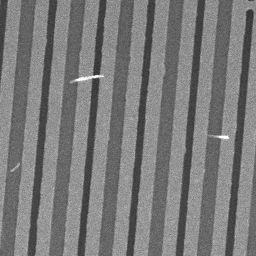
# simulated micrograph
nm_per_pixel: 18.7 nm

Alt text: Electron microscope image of parallel lines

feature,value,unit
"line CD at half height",251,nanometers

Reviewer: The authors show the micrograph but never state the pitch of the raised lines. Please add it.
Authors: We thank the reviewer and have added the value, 459 nanometers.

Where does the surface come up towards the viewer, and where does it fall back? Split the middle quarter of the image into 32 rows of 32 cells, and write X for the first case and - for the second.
----XXX--XXXX---XXXX-XXXX----XXX
----XXX--XXXX---XXXX-XXXX----XXX
----XXX--XXX----XXX--XXXX----XXX
---XXXXX-XXX----XXX--XXXX---XXXX
---XXXX--XXX----XXX--XXXX---XXXX
---XXXX--XXX----XXX--XXX----XXX-
---XXXX--XXX----XXX--XXX----XXX-
---XXXX--XXX----XXX--XXX----XXX-
---XXXX--XXX---XXXX--XXX----XXX-
---XXXX--XXX---XXXX--XXX----XXX-
---XXX---XXX---XXXX--XXX----XXX-
---XXX--XXXX---XXXX--XXX----XXX-
---XXX--XXXX---XXXX-XXXX----XXX-
---XXX--XXX----XXX--XXXX----XXX-
---XXX--XXX----XXX--XXXX---XXXX-
---XXX--XXX----XXX--XXXX---XXXX-
---XXX--XXX----XXX--XXXX---XXX--
--XXXX--XXX----XXX--XXX----XXX--
--XXXX--XXX----XXX--XXX----XXX--
--XXXX--XXX----XXX--XXX----XXX--
--XXXX--XXX---XXXX--XXX----XXX--
--XXXX--XXX---XXXX--XXX----XXX--
--XXX---XXX----XXX--XXX----XXX--
--XXX--XXXX---XXXX--XXX----XXX--
--XXX--XXXX---XXXX-XXXX----XXX--
--XXX--XXX----XXX--XXXX----XXX--
--XXX--XXX----XXX--XXXX---XXXX--
--XXX--XXX----XXX--XXXX---XXXX--
-XXXX--XXX----XXX--XXX----XXX---
-XXXX--XXX----XXX--XXX----XXX--X
-XXXX--XXX----XXX--XXX----XXX--X
-XXXX--XXX---XXXX--XXX----XXX--X